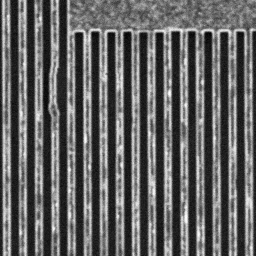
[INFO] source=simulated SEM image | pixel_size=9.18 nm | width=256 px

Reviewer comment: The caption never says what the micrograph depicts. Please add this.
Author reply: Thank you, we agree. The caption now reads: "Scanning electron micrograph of parallel lines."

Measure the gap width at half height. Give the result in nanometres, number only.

91.8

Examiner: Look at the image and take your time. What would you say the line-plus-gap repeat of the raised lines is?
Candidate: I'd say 148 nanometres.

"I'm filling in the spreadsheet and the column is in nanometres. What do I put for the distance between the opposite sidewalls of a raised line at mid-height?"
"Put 64.3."